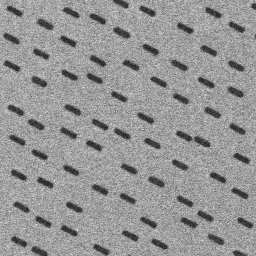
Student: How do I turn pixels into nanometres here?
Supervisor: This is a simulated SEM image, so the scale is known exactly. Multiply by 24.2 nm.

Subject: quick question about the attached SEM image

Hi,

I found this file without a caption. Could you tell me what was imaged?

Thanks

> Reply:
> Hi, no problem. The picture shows a regular array of holes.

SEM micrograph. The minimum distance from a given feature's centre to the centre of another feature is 647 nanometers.